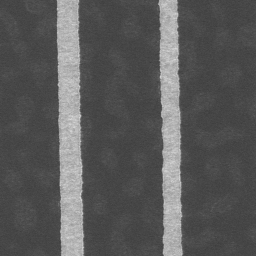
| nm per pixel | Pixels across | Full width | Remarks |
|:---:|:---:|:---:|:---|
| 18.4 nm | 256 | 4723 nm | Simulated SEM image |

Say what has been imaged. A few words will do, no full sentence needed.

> one or a few lines or trenches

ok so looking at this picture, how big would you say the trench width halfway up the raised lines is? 1510 nm